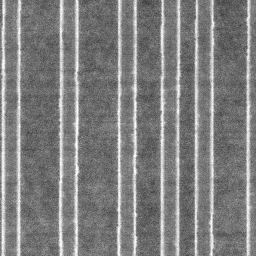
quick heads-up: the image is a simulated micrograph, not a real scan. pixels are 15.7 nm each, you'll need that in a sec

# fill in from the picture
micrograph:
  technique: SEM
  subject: lines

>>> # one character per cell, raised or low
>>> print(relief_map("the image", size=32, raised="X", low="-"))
XX------XX-----XX---XX---XX----X
XX------XX-----XX---XX---XX----X
XX------XX-----XX---XX---XX----X
XX------XX-----XX---XX---XX----X
XX------XX-----XX---XX---XX----X
XX------XX-----XX---XX---XX----X
XX------XX-----XX---XX---XX----X
XX------XX-----XX---XX---XX----X
XX------XX-----XX---XX---XX----X
XX------XX-----XX---XX--XXX----X
XX------XX-----XX---XX--XXX----X
XX------XX-----XX---XX---XX----X
XX------XX-----XX---XX---XX----X
XX------XX-----XX---XX---XX----X
XX------XX-----XX---XX---XX----X
XX------XX-----XX---XX---X-----X
XX------XX-----XX---XX---X-----X
XX------XX-----XX---XX---X-----X
XX------XX-----XX---XX---X-----X
XX------XX-----XX---XX--XXX----X
XX------XX-----XX---XX--XXX----X
XX------XX-----XX---XX--XXX----X
XX------XX-----XX---XX---XX----X
XX------XX-----XX---XX---XX----X
XX------XX-----XX---XX--XX-----X
XX------XX-----XX---XX--XX-----X
XX------XX-----XX---XX--XX-----X
XX------X------XX---XX--XX-----X
XX------XX-----XX---XX--XX-----X
XX------XX-----XX---XX--XX-----X
XX------XX-----XX---XX--XX-----X
XX------X------XX---XX--XX-----X